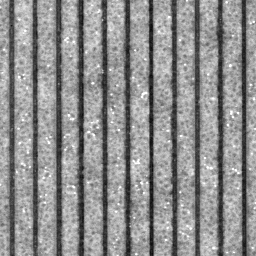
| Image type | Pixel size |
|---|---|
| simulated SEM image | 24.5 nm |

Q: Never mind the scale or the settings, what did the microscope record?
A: parallel lines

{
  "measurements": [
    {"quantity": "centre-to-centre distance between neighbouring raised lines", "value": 568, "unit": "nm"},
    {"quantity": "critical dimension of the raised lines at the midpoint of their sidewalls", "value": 438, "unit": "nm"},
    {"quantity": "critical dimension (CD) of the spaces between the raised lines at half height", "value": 0.126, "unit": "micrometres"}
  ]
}